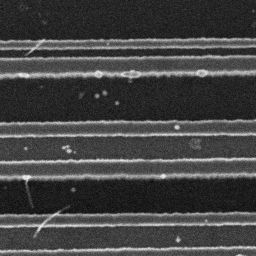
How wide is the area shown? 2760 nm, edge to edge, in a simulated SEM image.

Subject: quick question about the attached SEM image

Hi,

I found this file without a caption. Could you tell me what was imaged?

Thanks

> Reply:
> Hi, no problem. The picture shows lines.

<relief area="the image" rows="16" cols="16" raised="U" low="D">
DDDDDDDDDDDDDDDD
DDDDDDDDDDDDDDDD
DDDDDDUDUUUUUUUU
UUUUUUUUUUUUUUUU
UUUUUUUUUUUUUUDD
DDDDDDDDDDDDDDDD
DDDDDDDDDDDDDDDD
DDDDDDDDDDDDDDDD
UUUUUUUUUUUUUUUU
UUUUUUUUUUUUUUUU
UUUUUUUUUUUUUUUU
DDDDDDDDDDDDDDDD
DDDDDDDDDDDDDDDD
UUUUUUUUUUUUUUUU
UUUUUUUUUUUUUUUU
UUUUUUUUUUUUUUUU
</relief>